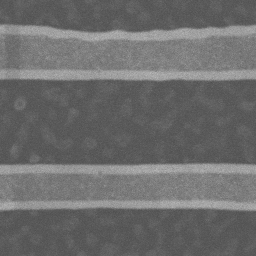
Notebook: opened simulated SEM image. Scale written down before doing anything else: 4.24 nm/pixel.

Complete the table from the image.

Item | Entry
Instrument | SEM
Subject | one or a few lines or trenches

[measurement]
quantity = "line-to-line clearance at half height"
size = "392 nm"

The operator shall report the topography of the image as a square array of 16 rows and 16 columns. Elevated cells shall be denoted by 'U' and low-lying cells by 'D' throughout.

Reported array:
DDDDDDDDDDDDDDDD
DDDDDDDDDDDDDDDD
UUUUUUUUUUUUUUUU
UUUUUUUUUUUUUUUU
UUUUUUUUUUUUUUUU
DDDDDDDDDDDDDDDD
DDDDDDDDDDDDDDDD
DDDDDDDDDDDDDDDD
DDDDDDDDDDDDDDDD
DDDDDDDDDDDDDDDD
DDDDDDDDDDDUUUDD
UUUUUUUUUUUUUUUU
UUUUUUUUUUUUUUUU
DDDDDDDDDDDDDDDD
DDDDDDDDDDDDDDDD
DDDDDDDDDDDDDDDD